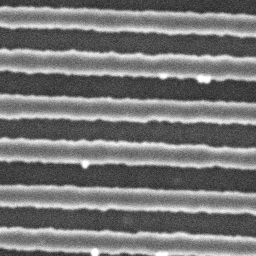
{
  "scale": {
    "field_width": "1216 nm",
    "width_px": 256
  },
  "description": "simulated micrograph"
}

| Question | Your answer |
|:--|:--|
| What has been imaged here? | lines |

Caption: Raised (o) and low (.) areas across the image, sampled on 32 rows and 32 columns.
................................
ooooooooooooooooooo.............
oooooooooooooooooooooooooooooooo
..........oooooooooooooooooooooo
..............................o.
................................
ooooo.o.oo......................
oooooooooooooooooooooooooooooooo
oooooooooooooooooooooooooooooooo
................o.oooooooooooooo
................................
................................
ooooooooooooooooooo.............
oooooooooooooooooooooooooooooooo
oooooooooooooooooooooooooooooooo
................................
................................
ooo.............................
ooooooooooooooooooooooooooo.....
oooooooooooooooooooooooooooooooo
..........o.....oooooooooooooooo
................................
................................
oooooooooo......................
oooooooooooooooooooooooooooooooo
oooooooooooooooooooooooooooooooo
..........................oooooo
................................
o.o.............................
ooooooooooooooooooooooooooo.....
oooooooooooooooooooooooooooooooo
...........oooo.oooooooooooooooo